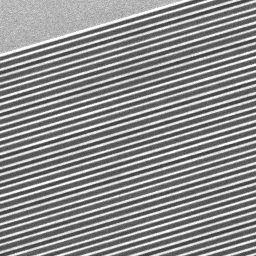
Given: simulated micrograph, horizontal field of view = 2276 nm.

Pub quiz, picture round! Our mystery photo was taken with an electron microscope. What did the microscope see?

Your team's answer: parallel lines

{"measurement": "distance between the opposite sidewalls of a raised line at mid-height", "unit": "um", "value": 0.0181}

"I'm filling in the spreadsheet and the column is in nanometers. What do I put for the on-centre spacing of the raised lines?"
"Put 59.9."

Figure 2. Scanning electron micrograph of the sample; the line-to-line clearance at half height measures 35.2 nanometers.